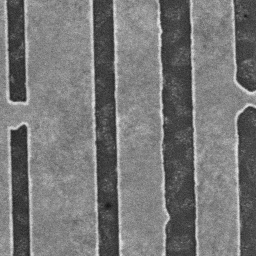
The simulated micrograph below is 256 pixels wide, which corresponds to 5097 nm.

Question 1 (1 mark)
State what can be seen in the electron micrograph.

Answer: one or a few lines or trenches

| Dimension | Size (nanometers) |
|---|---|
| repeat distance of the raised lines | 1540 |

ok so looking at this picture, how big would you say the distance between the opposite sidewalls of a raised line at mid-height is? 888 nm